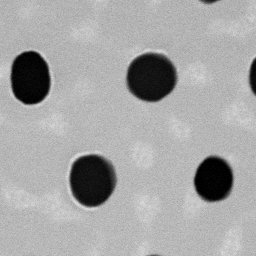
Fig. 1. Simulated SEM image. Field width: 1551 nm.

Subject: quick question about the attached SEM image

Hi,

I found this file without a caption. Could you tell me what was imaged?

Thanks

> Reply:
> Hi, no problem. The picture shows holes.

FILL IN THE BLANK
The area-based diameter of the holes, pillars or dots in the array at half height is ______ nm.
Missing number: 287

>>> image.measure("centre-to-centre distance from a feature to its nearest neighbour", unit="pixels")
119